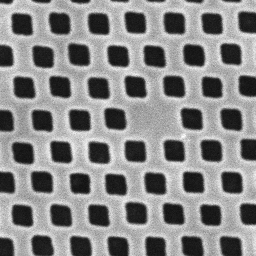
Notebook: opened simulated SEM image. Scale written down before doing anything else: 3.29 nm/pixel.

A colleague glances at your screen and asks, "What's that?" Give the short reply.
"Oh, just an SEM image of a regular array of holes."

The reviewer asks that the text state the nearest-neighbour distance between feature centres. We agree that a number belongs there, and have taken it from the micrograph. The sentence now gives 118 nanometres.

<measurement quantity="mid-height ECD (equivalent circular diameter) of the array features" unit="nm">75.6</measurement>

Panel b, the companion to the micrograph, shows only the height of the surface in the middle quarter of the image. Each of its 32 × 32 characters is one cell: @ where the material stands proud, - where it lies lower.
@@@@--@@@@@@----@@@@@----@@@@@@@
@@@@@@@@@@@@@@@@@@@@@@@@@@@@@@@@
@@@@@@@@@@@@@@@@@@@@@@@@@@@@@@@@
-@@@@@----@@@@@-----@@@@@----@@@
--@@@@-----@@@@-----@@@@@-----@@
--@@@@-----@@@@-----@@@@@-----@@
--@@@@-----@@@@------@@@@-----@@
--@@@@-----@@@@@-----@@@@-----@@
-@@@@@@----@@@@@@@--@@@@@@@@@@@@
@@@@@@@@@@@@@@@@@@@@@@@@@@@@@@@@
@@@@@@@@@@@@@@@@@@@@@@@@@@@@@@@@
@@---@@@@@-----@@@@@@@@@@@@@@---
@-----@@@@-----@@@@@@@@@@@@@@---
@------@@@------@@@@@@@@@@@@@---
@------@@@------@@@@@@@@@@@@@---
@@-----@@@@-----@@@@@@@@@@@@@@--
@@----@@@@@@@@-@@@@@@@@@@@@@@@@@
@@@@@@@@@@@@@@@@@@@@@@@@@@@@@@@@
@@@@@@@@@@@@@@@@@@@@@@@@@@@@@@@@
-@@@@@----@@@@@-----@@@@@-----@@
--@@@@-----@@@@-----@@@@@-----@@
--@@@@-----@@@@-----@@@@@-----@@
--@@@@-----@@@@------@@@@-----@@
--@@@@-----@@@@@-----@@@@-----@@
--@@@@@----@@@@@@---@@@@@@@-@@@@
@@@@@@@@@@@@@@@@@@@@@@@@@@@@@@@@
@@@@@@@@@@@@@@@@@@@@@@@@@@@@@@@@
@@----@@@@@---@@@@@@-----@@@@@--
@------@@@-----@@@@@-----@@@@@--
@@-----@@@------@@@@-----@@@@@--
@@-----@@@------@@@@------@@@@--
@@-----@@@------@@@@------@@@@--